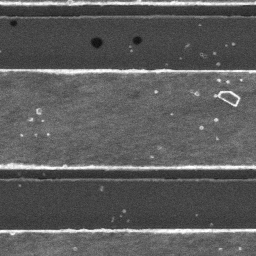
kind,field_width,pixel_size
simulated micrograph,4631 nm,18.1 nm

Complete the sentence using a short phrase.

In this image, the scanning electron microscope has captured lines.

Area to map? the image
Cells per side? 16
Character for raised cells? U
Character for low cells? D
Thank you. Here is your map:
DDDDDDDDDDDDDDDD
DDDDDDDDDDDDDDDD
DDDDDDDDDDDDDDDD
DDDDDDDDDDDDDDDD
UUUUUUUUUUUUUUUU
UUUUUUUUUUUUUUUU
UUUUUUUUUUUUUUUU
UUUUUUUUUUUUUUUU
UUUUUUUUUUUUUUUU
UUUUUUUUUUUUUUUU
UUUUUUUUUUUUUUUU
DDDDDDDDDDDDDDDD
DDDDDDDDDDDDDDDD
DDDDDDDDDDDDDDDD
UUUUUUUUUUUUUUUU
UUUUUUUUUUUUUUUU